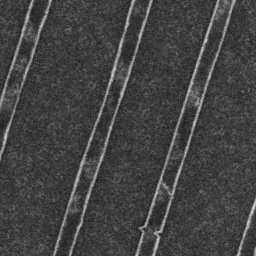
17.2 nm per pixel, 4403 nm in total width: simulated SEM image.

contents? one or a few lines or trenches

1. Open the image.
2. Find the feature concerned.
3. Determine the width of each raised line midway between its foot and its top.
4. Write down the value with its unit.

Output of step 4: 16.3 px